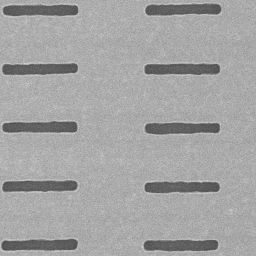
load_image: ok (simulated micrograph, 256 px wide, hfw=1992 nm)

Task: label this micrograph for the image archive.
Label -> a regular array of holes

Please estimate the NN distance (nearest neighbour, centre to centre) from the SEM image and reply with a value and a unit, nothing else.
455 nanometers